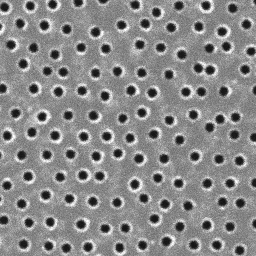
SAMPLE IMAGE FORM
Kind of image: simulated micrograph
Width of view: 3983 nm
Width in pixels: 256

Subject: a regular array of holes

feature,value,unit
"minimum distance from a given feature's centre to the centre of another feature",323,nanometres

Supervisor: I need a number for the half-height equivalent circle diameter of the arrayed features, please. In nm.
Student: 163